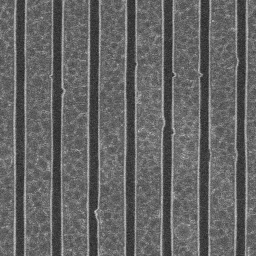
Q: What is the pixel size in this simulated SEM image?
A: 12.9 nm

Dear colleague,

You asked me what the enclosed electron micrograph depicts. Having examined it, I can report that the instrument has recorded parallel lines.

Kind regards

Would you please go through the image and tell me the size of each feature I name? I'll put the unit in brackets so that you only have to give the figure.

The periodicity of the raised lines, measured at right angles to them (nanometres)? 476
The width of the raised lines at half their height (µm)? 0.342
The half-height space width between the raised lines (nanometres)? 126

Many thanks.